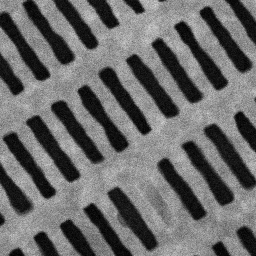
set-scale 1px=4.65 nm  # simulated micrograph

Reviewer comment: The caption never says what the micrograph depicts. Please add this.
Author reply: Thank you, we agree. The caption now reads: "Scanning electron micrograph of a regular array of holes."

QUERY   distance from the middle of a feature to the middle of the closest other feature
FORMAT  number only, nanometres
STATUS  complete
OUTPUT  134